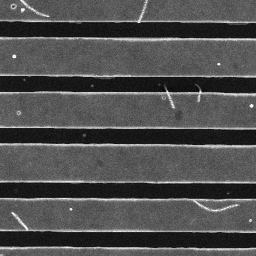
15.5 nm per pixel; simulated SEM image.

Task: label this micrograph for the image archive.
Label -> lines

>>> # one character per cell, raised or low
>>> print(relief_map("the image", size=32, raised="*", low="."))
********************************
********************************
********************************
................................
................................
********************************
********************************
********************************
********************************
......**************************
................................
....****............*....*......
********************************
********************************
********************************
********************************
................................
................................
********************************
********************************
********************************
********************************
********************************
................................
................................
********************************
********************************
********************************
********************************
................................
................................
********************************